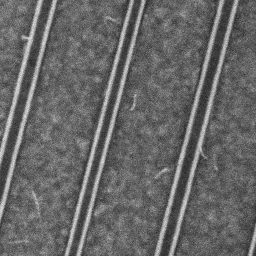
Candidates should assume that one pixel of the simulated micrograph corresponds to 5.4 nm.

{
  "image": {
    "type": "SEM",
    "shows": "one or a few lines or trenches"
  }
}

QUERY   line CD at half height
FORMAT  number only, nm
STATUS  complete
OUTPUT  79.2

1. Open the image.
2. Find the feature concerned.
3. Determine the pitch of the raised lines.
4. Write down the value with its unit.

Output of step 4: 477 nm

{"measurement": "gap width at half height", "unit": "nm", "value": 405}